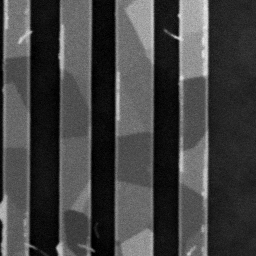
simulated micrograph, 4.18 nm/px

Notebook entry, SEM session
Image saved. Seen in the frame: parallel lines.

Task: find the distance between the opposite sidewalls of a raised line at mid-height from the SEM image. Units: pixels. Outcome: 29.8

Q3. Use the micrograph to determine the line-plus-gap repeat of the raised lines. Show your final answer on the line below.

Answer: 58.9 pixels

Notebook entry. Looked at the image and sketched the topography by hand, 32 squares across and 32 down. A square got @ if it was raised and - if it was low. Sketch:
-@@@----@@@----@@@@----@@@------
-@@@----@@@----@@@@---@@@@------
-@@@----@@@----@@@@---@@@@------
-@@@----@@@----@@@@---@@@@------
-@@@---@@@@----@@@@---@@@@------
-@@@----@@@----@@@@---@@@@------
-@@@---@@@@----@@@@---@@@@------
@@@@---@@@@----@@@@---@@@@------
@@@@----@@@----@@@@---@@@@------
-@@@----@@@----@@@@---@@@@------
@@@@----@@@----@@@@---@@@@------
@@@@----@@@----@@@@---@@@@------
@@@@----@@@---@@@@@---@@@@------
@@@@----@@@---@@@@@----@@@------
@@@@----@@@---@@@@@----@@@------
@@@@----@@@---@@@@@----@@@------
@@@@----@@@---@@@@@----@@@------
@@@@----@@@---@@@@@----@@@------
@@@@----@@@---@@@@@---@@@@------
@@@@----@@@---@@@@@---@@@@------
@@@@---@@@@---@@@@@---@@@@------
@@@@---@@@@---@@@@@---@@@@------
@@@@---@@@@---@@@@@---@@@@------
@@@@---@@@@---@@@@@---@@@@------
@@@@----@@@---@@@@@---@@@@------
@@@@----@@@---@@@@@---@@@@------
@@@@----@@@---@@@@@---@@@@------
@@@@----@@@---@@@@@---@@@@------
@@@-----@@@---@@@@@---@@@@------
@@@-----@@@---@@@@@---@@@@------
@@@@---@@@@---@@@@@---@@@@------
@@@----@@@@---@@@@@---@@@@------